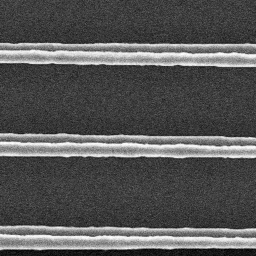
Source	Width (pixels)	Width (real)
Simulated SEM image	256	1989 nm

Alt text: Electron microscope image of lines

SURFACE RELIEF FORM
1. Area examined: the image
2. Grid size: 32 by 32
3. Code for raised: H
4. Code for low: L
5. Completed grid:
LLLLLLLLLLLLLLLLLLLLLLLLLLLLLLLL
LLLLLLLLLLLLLLLLLLLLLLLLLLLLLLLL
LLLLLLLLLLLLLLLLLLLLLLLLLLLLLLLL
LLLLLLLLLLLLLLLLLLLLLLLLLLLLLLLL
LLLLLLLLLLLLLLLLLLLLLLLLLLLLLLLL
HHHHHHHHLLLLLHHLLLLLLLLLLLLLLLLL
HHHHHHHHHHHHHHHHHHHHHHHHHHHHHHHH
HHHHHHHHHHHHHHHHHHHHHHHHHHHHHHHH
LLLLLLLLLLLLLLLLLLLLLLLLLLLLLLLL
LLLLLLLLLLLLLLLLLLLLLLLLLLLLLLLL
LLLLLLLLLLLLLLLLLLLLLLLLLLLLLLLL
LLLLLLLLLLLLLLLLLLLLLLLLLLLLLLLL
LLLLLLLLLLLLLLLLLLLLLLLLLLLLLLLL
LLLLLLLLLLLLLLLLLLLLLLLLLLLLLLLL
LLLLLLLLLLLLLLLLLLLLLLLLLLLLLLLL
LLLLLLLLLLLLLLLLLLLLLLLLLLLLLLLL
LLLLLLLLLLLLLLLLLLLLLLLLLLLLLLLL
HHHHHHHHHHHHHHHHHHHHHHHHHHHHHHHH
HHHHHHHHHHHHHHHHHHHHHHHHHHHHHHHH
LLLLLLLLHLLLHLLHHHHHHHHHHHHHHHHH
LLLLLLLLLLLLLLLLLLLLLLLLLLLLLLLL
LLLLLLLLLLLLLLLLLLLLLLLLLLLLLLLL
LLLLLLLLLLLLLLLLLLLLLLLLLLLLLLLL
LLLLLLLLLLLLLLLLLLLLLLLLLLLLLLLL
LLLLLLLLLLLLLLLLLLLLLLLLLLLLLLLL
LLLLLLLLLLLLLLLLLLLLLLLLLLLLLLLL
LLLLLLLLLLLLLLLLLLLLLLLLLLLLLLLL
LLLLLLLLLLLLLLLLLLLLLLLLLLLLLLLL
HHHHHHHHLLLLLLLLLLLLLLLLLLLLLLLL
HHHHHHHHHHHHHHHHHHHHHHHHHHHHHHHH
HHHHHHHHHHHHHHHHHHHHHHHHHHHHHHHH
LLLLLLLLLLLLLLLLLLLLLLLLLLLLLLLL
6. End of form